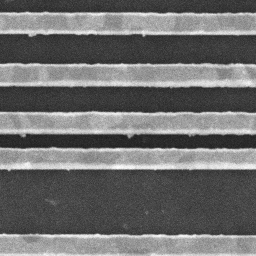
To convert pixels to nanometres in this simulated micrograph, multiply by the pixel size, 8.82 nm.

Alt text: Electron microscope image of lines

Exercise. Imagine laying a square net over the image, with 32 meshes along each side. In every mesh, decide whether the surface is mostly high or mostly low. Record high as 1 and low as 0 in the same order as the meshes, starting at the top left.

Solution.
00000000000000000000000000000000
00000000000000000000000000000000
11111111111111111111111111111111
11111111111111111111111111111111
00000000000000000000000000000000
00000000000000000000000000000000
00000000000000000000000000000000
00000000000000000000000000000000
11111111111111111111111111111111
11111111111111111111111111111111
11111111111111111111111111111111
00000000000000000000000000000000
00000000000000000000000000000000
00000000000000000000000000000000
11111111111111111111111111111111
11111111111111111111111111111111
11111111111111111111111111111111
00000000000000000000000000000000
00000010000000000000000000000000
11111111111111111111111111111111
11111111111111111111111111111111
00000000000000000000000000000000
00000000000000000000000000000000
00000000000000000000000000000000
00000000000000000000000000000000
00000000000000000000000000000000
00000000000000000000000000000000
00000000000000000000000000000000
00000000000000000000000000000000
11111111111111110011101011110000
11111111111111111111111111111111
11111111111111111111111111111111